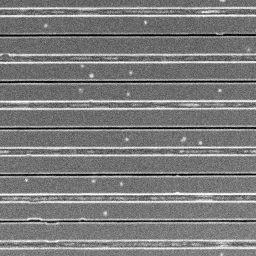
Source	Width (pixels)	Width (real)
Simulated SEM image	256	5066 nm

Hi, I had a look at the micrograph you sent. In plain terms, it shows parallel lines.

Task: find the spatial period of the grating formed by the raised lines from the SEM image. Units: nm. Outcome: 455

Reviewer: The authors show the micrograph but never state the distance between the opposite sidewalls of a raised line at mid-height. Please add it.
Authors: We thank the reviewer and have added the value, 18.6 pixels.